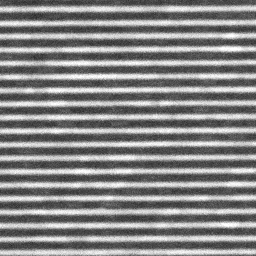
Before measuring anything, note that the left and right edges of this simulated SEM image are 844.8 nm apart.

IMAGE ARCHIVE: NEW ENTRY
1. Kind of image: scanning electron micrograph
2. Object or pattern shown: parallel lines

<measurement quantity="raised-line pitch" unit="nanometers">44.7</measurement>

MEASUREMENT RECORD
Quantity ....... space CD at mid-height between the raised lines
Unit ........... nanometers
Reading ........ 34.3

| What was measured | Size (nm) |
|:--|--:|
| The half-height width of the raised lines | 11.6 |